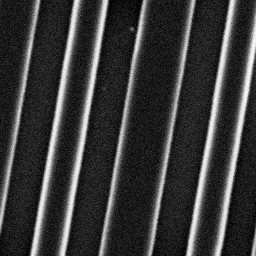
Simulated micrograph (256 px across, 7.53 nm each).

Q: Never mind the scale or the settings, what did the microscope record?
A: lines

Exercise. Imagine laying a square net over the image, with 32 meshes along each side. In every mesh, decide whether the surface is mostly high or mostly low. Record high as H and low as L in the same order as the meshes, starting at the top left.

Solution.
HHHHHLLLLHHHHLLLLLHHHHHHLLLLLHHH
HHHHHLLLLHHHHLLLLLHHHHHHLLLLLHHH
HHHHHLLLLHHHHLLLLHHHHHHHLLLLHHHH
HHHHLLLLLHHHHLLLLHHHHHHHLLLLHHHH
HHHHLLLLLHHHHLLLLHHHHHHHLLLLHHHH
HHHHLLLLHHHHHLLLLHHHHHHLLLLLHHHH
HHHHLLLLHHHHLLLLLHHHHHHLLLLLHHHH
HHHHLLLLHHHHLLLLLHHHHHHLLLLLHHHH
HHHLLLLLHHHHLLLLHHHHHHHLLLLHHHHL
HHHLLLLLHHHHLLLLHHHHHHHLLLLHHHHL
HHHLLLLLHHHHLLLLHHHHHHHLLLLHHHHL
HHHLLLLHHHHHLLLLHHHHHHLLLLLHHHHL
HHHLLLLHHHHLLLLLHHHHHHLLLLLHHHHL
HHHLLLLHHHHLLLLLHHHHHHLLLLLHHHHL
HHLLLLLHHHHLLLLHHHHHHHLLLLHHHHLL
HHLLLLLHHHHLLLLHHHHHHHLLLLHHHHLL
HHLLLLLHHHHLLLLHHHHHHHLLLLHHHHLL
HHLLLLHHHHHLLLLHHHHHHLLLLLHHHHLL
HHLLLLHHHHLLLLLHHHHHHLLLLLHHHHLL
HHLLLLHHHHLLLLLHHHHHHLLLLHHHHHLL
HLLLLLHHHHLLLLHHHHHHHLLLLHHHHLLL
HLLLLLHHHHLLLLHHHHHHHLLLLHHHHLLL
HLLLLLHHHHLLLLHHHHHHHLLLLHHHHLLL
HLLLLHHHHLLLLLHHHHHHLLLLLHHHHLLL
HLLLLHHHHLLLLLHHHHHHLLLLLHHHHLLL
HLLLLHHHHLLLLLHHHHHHLLLLHHHHHLLL
LLLLLHHHHLLLLHHHHHHHLLLLHHHHLLLL
LLLLLHHHHLLLLHHHHHHHLLLLHHHHLLLL
LLLLHHHHHLLLLHHHHHHLLLLLHHHHLLLL
LLLLHHHHLLLLLHHHHHHLLLLLHHHHLLLL
LLLLHHHHLLLLLHHHHHHLLLLLHHHHLLLL
LLLLHHHHLLLLLHHHHHHLLLLHHHHHLLLL